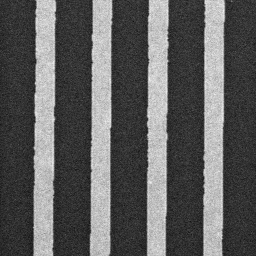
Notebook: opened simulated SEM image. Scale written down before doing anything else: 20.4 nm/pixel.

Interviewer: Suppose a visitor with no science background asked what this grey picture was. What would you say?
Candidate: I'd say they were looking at lines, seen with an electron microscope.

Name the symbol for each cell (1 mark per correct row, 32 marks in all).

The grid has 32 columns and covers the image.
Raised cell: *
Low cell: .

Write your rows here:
.....**.....**.....**.....**....
.....**.....**.....**.....**....
.....**.....**.....**.....**....
.....**.....**.....**.....**....
.....**.....**.....**.....**....
.....**.....**.....**.....**....
.....**.....**.....**.....**....
.....**.....**.....**.....**....
.....**.....**.....**.....**....
.....**.....**.....**.....**....
.....**.....**.....**.....**....
....***.....**.....**.....**....
....***.....**.....**.....**....
....***.....**....***.....**....
....***.....**.....**.....**....
....***.....**.....**.....**....
....***.....**....***.....**....
....***....***.....**.....**....
....***....***.....**.....**....
....***....***.....**.....**....
....***....***.....**.....**....
....***....***....***.....**....
....***....***....***.....**....
....***....***....***.....**....
....***....***....***.....**....
....***....***....***.....**....
....***....***....***.....**....
....***....***....***.....**....
....***....***....***.....**....
....***....***....***.....**....
....**.....***....***.....**....
....***....***....***.....**....